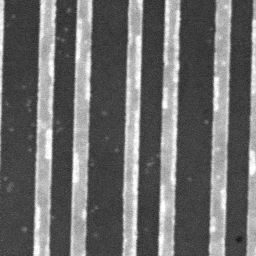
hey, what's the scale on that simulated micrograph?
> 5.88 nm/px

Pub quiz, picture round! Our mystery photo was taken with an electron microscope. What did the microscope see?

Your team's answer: parallel lines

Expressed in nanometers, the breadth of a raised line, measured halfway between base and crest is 81.6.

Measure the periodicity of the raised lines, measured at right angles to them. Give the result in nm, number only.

258